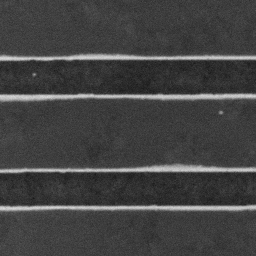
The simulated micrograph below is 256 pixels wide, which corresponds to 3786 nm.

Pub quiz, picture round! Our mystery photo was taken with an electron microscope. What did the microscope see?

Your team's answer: lines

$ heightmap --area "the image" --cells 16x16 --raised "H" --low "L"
HHHHHHHHHHHHHHHH
HHHHHHHHHHHHHHHH
HHHHHHHHHHHHHHHH
HHHHHHHHHHHHHHHH
LLLLLLLLLLLLLLLL
LLLLLLLLLLLLLLLL
HHHHHHHHHHHHHHHH
HHHHHHHHHHHHHHHH
HHHHHHHHHHHHHHHH
HHHHHHHHHHHHHHHH
HHHHHHHHHHHHHHHH
LLLLLLLLLLLLLLLL
LLLLLLLLLLLLLLLL
HHHHHHHHHHHHHHHH
HHHHHHHHHHHHHHHH
HHHHHHHHHHHHHHHH